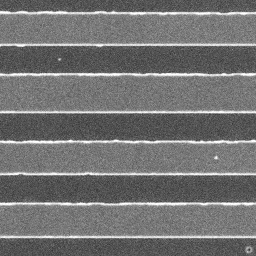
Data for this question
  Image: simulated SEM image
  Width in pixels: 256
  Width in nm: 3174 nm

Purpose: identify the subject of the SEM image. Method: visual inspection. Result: lines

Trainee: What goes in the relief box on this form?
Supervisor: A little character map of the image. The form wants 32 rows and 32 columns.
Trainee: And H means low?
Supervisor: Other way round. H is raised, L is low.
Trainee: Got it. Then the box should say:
LLLLLLLLLLLLLLLLLLLLLLLLLLLLLLLL
LLLLLLLLLLLLLLLLLLLLLLLLLLLLLLLL
HHHHHHHHHHHHHHHHHHHHHHHHHHHHHHHH
HHHHHHHHHHHHHHHHHHHHHHHHHHHHHHHH
HHHHHHHHHHHHHHHHHHHHHHHHHHHHHHHH
HHHHHHHHHHHHHHHHHHHHHHHHHHHHHHHH
LLLLLLLLLLLLLLLLLLLLLLLLLLLLLLLL
LLLLLLLLLLLLLLLLLLLLLLLLLLLLLLLL
LLLLLLLLLLLLLLLLLLLLLLLLLLLLLLLL
HHHHHHHHHHHHHHHHHHHHHHHHHHHHHHHH
HHHHHHHHHHHHHHHHHHHHHHHHHHHHHHHH
HHHHHHHHHHHHHHHHHHHHHHHHHHHHHHHH
HHHHHHHHHHHHHHHHHHHHHHHHHHHHHHHH
HHHHHHHHHHHHHHHHHHHHHHHHHHHHHHHH
LLLLLLLLLLLLLLLLLLLLLLLLLLLLLLLL
LLLLLLLLLLLLLLLLLLLLLLLLLLLLLLLL
LLLLLLLLLLLLLLLLLLLLLLLLLLLLLLLL
LLLLLLLLLLLLLLLLLLLLLLLLLLLLLLLL
HHHHHHHHHHHHHHHHHHHHHHHHHHHHHHHH
HHHHHHHHHHHHHHHHHHHHHHHHHHHHHHHH
HHHHHHHHHHHHHHHHHHHHHHHHHHHHHHHH
HHHHHHHHHHHHHHHHHHHHHHHHHHHHHHHH
LLLLLLLLLLLLLLLLLLLLLLLLLLLLLLLL
LLLLLLLLLLLLLLLLLLLLLLLLLLLLLLLL
LLLLLLLLLLLLLLLLLLLLLLLLLLLLLLLL
HHHHHHHHHHHHHLLHHHHHHHHHHHHHHHHH
HHHHHHHHHHHHHHHHHHHHHHHHHHHHHHHH
HHHHHHHHHHHHHHHHHHHHHHHHHHHHHHHH
HHHHHHHHHHHHHHHHHHHHHHHHHHHHHHHH
HHHHHHHHHHHHHHHHHHHHHHHHHHHHHHHH
LLLLLLLLLLLLLLLLLLLLLLLLLLLLLLLL
LLLLLLLLLLLLLLLLLLLLLLLLLLLLLLLL